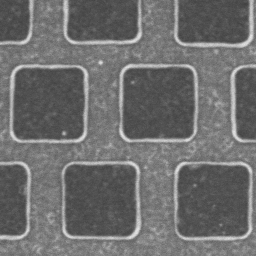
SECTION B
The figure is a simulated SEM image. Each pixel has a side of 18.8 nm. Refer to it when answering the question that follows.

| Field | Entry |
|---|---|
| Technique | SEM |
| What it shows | raised bodies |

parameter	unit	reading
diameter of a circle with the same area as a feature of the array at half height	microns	1.59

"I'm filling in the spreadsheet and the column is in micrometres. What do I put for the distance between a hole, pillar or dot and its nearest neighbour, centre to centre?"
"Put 2.06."